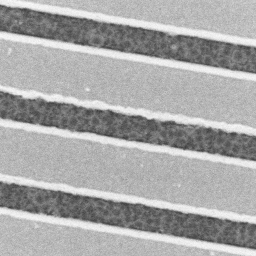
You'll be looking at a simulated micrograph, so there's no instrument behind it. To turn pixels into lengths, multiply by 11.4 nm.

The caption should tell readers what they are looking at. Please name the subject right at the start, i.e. one or a few lines or trenches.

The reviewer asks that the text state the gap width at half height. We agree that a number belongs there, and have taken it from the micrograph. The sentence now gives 382 nm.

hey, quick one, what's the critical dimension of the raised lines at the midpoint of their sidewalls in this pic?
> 613 nm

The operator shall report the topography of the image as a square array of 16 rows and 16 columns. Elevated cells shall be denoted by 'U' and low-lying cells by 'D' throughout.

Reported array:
DDDUUUUUUUUUUUUU
DDDDDDDDDUUUUUUU
UUDDDDDDDDDDDDDU
UUUUUUUUDDDDDDDD
UUUUUUUUUUUUUUDD
UUUUUUUUUUUUUUUU
DDDDDUUUUUUUUUUU
DDDDDDDDDDDUUUUU
UUUUUDDDDDDDDDDD
UUUUUUUUUUUDDDDD
UUUUUUUUUUUUUUUU
DDUUUUUUUUUUUUUU
DDDDDDDDUUUUUUUU
UUDDDDDDDDDDDDUU
UUUUUUUUDDDDDDDD
UUUUUUUUUUUUUUDD